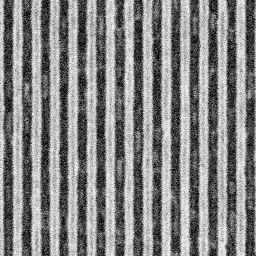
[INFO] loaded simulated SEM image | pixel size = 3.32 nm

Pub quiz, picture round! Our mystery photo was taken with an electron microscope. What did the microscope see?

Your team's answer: parallel lines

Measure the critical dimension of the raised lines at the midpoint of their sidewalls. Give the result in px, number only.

8.37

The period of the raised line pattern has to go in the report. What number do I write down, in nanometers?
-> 61.8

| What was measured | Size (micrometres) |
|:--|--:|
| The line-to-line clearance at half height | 0.0341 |